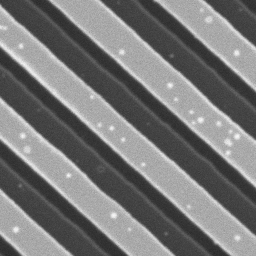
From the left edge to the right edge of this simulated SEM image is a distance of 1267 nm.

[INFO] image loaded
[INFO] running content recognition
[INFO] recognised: lines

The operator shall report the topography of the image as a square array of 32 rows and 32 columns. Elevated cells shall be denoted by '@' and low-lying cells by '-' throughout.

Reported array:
-------@@@@@@-------@@@@@@------
@-------@@@@@@-------@@@@@@-----
@@-------@@@@@@-------@@@@@@----
@@@-------@@@@@@-------@@@@@@---
@@@@-------@@@@@@-------@@@@@@--
@@@@@-------@@@@@@--------@@@@@-
-@@@@@-------@@@@@@--------@@@@@
--@@@@@-------@@@@@@--------@@@@
---@@@@@--------@@@@@@-------@@@
----@@@@@@-------@@@@@@-------@@
-----@@@@@@-------@@@@@@-------@
------@@@@@@-------@@@@@@-------
-------@@@@@@-------@@@@@@------
@--------@@@@@-------@@@@@@-----
@@--------@@@@@-------@@@@@@----
@@@@-------@@@@@-------@@@@@@---
@@@@@-------@@@@@-------@@@@@@@-
@@@@@@-------@@@@@-------@@@@@@@
-@@@@@@-------@@@@@@-------@@@@@
--@@@@@@-------@@@@@@-------@@@@
----@@@@@-------@@@@@@-------@@@
-----@@@@@-------@@@@@@-------@@
------@@@@@-------@@@@@@-------@
-------@@@@@--------@@@@@-------
@-------@@@@@--------@@@@@------
@@-------@@@@@@-------@@@@@-----
@@@-------@@@@@@-------@@@@@----
@@@@-------@@@@@@-------@@@@@@--
@@@@@-------@@@@@@-------@@@@@@-
@@@@@@-------@@@@@@-------@@@@@@
-@@@@@@--------@@@@@-------@@@@@
--@@@@@@@-------@@@@@-------@@@@